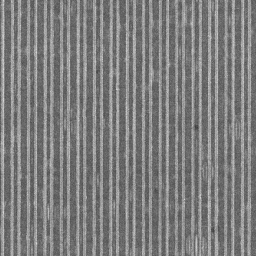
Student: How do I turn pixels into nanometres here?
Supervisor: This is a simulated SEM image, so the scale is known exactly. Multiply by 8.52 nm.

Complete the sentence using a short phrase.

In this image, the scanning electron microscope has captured parallel lines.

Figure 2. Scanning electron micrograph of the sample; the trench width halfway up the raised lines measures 45.8 nm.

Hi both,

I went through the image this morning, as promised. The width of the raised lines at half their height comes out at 20.2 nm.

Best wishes